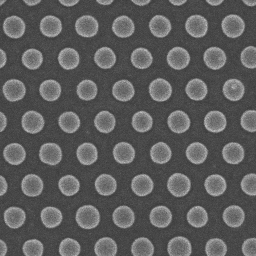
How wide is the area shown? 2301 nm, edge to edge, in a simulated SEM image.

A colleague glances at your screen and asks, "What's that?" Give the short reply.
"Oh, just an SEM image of a regular array of raised bodies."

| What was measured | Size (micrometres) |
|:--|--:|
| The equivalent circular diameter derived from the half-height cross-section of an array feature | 0.196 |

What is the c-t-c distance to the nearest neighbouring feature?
326 nm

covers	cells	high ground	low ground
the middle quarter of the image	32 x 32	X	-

XXX------XXX------XXX-----XXXXX-
--------------------------------
--------------------------------
--------------------------------
----XXX------XXX------XXXX-----X
---XXXXX----XXXXX----XXXXXX----X
---XXXXX----XXXXXX---XXXXXX----X
---XXXXX----XXXXXX---XXXXXX----X
----XXX------XXXX-----XXXX------
--------------------------------
--------------------------------
--------------------------------
XXX------XXX------XXX------XXX--
XXXX----XXXXX----XXXXX----XXXXX-
XXXX----XXXXX----XXXXX----XXXXX-
XXXX----XXXXX----XXXXX----XXXXX-
XXX------XXX------XXX------XXXX-
--------------------------------
--------------------------------
--------------------------------
----XXXX-----XXXX-----XXXX-----X
---XXXXX----XXXXXX----XXXXX----X
---XXXXX----XXXXXX----XXXXX----X
---XXXXX-----XXXX-----XXXXX----X
----XXX-------XX-------XXX------
--------------------------------
--------------------------------
----------------------------X---
XXX-----XXXX------XXXX----XXXXX-
XXXX----XXXXX----XXXXX----XXXXX-
XXXX----XXXXX----XXXXX----XXXXX-
XXXX----XXXXX----XXXXX----XXXXX-